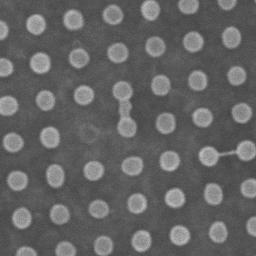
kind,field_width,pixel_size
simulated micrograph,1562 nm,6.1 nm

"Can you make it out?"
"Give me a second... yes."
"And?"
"a regular array of raised bodies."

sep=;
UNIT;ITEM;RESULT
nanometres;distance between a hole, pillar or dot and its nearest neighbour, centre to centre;230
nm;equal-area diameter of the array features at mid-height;118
